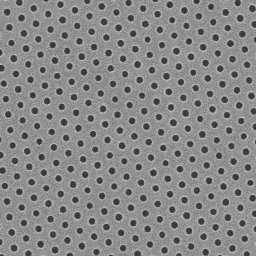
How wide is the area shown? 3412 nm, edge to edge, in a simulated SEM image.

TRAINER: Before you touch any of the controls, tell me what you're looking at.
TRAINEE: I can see a regular array of holes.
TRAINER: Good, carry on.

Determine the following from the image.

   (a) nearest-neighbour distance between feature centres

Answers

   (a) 205 nm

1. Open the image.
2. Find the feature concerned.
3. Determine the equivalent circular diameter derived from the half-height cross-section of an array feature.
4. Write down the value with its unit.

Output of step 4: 89 nm